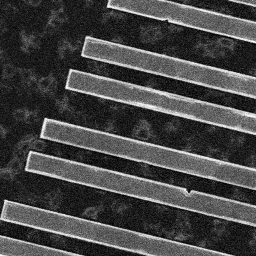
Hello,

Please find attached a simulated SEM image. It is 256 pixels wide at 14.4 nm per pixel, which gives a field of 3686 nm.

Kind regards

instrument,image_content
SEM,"parallel lines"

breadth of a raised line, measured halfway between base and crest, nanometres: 282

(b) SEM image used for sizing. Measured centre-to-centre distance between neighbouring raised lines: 650 nanometres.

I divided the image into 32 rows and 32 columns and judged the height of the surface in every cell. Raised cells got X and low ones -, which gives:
--------------XXXXXXXX---------X
----------------XXXXXXXXXX------
---------------------XXXXXXXXX--
-------------------------XXXXXXX
-----------------------------XXX
-----------XXX------------------
----------XXXXXXXXX-------------
------------XXXXXXXXXXX---------
-----------------XXXXXXXXXX-----
---------XXX---------XXXXXXXXXX-
--------XXXXXXXX---------XXXXXXX
----------XXXXXXXXXX---------XXX
--------------XXXXXXXXXX--------
------------------XXXXXXXXXXX---
----------------------XXXXXXXXXX
------XXX------------------XXXXX
-----XXXXXXXX------------------X
-------XXXXXXXXXX---------------
-----------XXXXXXXXXX-----------
----XX---------XXXXXXXXXX-------
---XXXXXXX---------XXXXXXXXXX---
----XXXXXXXXXXX--------XXXXXXXXX
--------XXXXXXXXXXX--------XXXXX
------------XXXXXXXXXXX--------X
-----------------XXXXXXXXXX-----
-X-------------------XXXXXXXXXX-
XXXXXX-------------------XXXXXXX
-XXXXXXXXXX------------------XXX
----XXXXXXXXXXX-----------------
--------XXXXXXXXXXX-------------
XXXX---------XXXXXXXXXX---------
XXXXXXXX---------XXXXXXXXXX-----